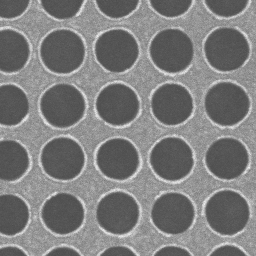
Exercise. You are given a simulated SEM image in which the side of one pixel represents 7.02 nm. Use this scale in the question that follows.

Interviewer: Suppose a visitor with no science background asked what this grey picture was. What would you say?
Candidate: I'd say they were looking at a regular array of holes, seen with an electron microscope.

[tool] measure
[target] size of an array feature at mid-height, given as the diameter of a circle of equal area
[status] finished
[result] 299 nanometers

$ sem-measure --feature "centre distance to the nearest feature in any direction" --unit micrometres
0.379